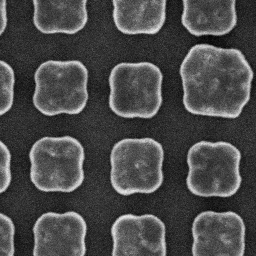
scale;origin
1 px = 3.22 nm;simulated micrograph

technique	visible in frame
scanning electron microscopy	raised bodies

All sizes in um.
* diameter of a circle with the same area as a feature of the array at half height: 0.182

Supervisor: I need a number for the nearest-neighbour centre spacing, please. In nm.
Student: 245